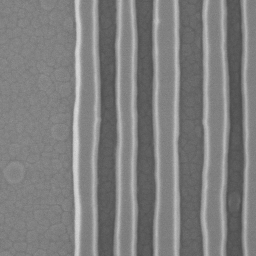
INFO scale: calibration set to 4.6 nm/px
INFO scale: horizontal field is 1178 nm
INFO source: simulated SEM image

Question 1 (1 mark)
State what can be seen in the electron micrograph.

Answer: parallel lines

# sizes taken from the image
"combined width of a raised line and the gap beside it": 197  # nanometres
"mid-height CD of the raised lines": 20.5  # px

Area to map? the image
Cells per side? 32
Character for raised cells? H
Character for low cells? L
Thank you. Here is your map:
LLLLLLLLLLHHLLLHHLLHHHLLLLHHLLHH
LLLLLLLLLLHHLLLHHLLHHHLLLLHHLLHH
LLLLLLLLLLHHLLLHHLLHHHLLLLHHLLHH
LLLLLLLLLLHHLLLHHLLHHHLLLLHHLLHH
LLLLLLLLLLHHLLLHHLLHHHLLLLHHLLLH
LLLLLLLLLLHHLLLHHLLHHHLLLLHHLLLH
LLLLLLLLLLHHLLLHHLLHHHLLLLHHLLLH
LLLLLLLLLLHHLLLHHLLHHHLLLLHHLLLH
LLLLLLLLLLHHLLLHHLLHHHLLLLHHLLHH
LLLLLLLLLLHHLLLHHLLHHHLLLLHHLLHH
LLLLLLLLLLHHLLLHHLLHHHLLLLHHLLHH
LLLLLLLLLLHHLLLHHLLHHHLLLLHHLLHH
LLLLLLLLLLHHLLLHHLLHHHLLLLHHLLLH
LLLLLLLLLHHHLLLHHLLHHHLLLLHHLLLH
LLLLLLLLLHHHLLLHHLLHHHLLLLHHLLLH
LLLLLLLLLHHHLLLHHLLHHHLLLLHHLLLH
LLLLLLLLLHHHLLLHHLLHHHLLLLHHLLLH
LLLLLLLLLHHHLLLHHLLLHHLLLLHHLLLH
LLLLLLLLLHHHLLLHHLLLHHLLLLHHLLLH
LLLLLLLLLHHHLLLHHLLLHHLLLLHHLLLH
LLLLLLLLLHHHLLLHHLLLHHLLLLHHLLLH
LLLLLLLLLHHHLLLHHLLLHHLLLLHHLLLH
LLLLLLLLLHHHLLLHHLLLHHLLLLHHLLLH
LLLLLLLLLHHHLLLHHLLLHHLLLLHHLLLH
LLLLLLLLLLHHLLLHHLLLHHLLLHHHLLLH
LLLLLLLLLLHHLLLHHLLLHHLLLHHHLLLH
LLLLLLLLLLHHLLLHHLLHHHLLLHHHLLLH
LLLLLLLLLLHHLLLHHLLHHHLLLHHHLLHH
LLLLLLLLLLHHLLLHHLLHHHLLLHHHLLHH
LLLLLLLLLLHHLLLHHLLHHHLLLLHHLLHH
LLLLLLLLLLHHLLLHHLLHHHLLLLHHLLHH
LLLLLLLLLLHHLLLHHLLHHHLLLLHHLLLH